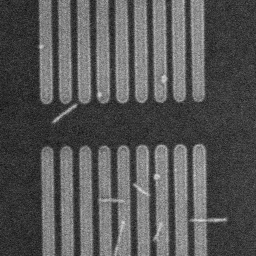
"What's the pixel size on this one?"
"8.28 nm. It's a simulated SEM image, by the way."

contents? groups of lines, slits or small figures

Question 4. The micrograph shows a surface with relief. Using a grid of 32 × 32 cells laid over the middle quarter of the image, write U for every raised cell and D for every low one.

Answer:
DDUUDDUUDDDUUDDDUUDDDUUDDUUDDDUU
DDUUDDUUDDDUUDDDUUDDDUUDDUUUDDUU
DDUUDDUUDDDUUDDDUUDDDUUDDUUUDDUU
DDUUDDUUUDDUUDDDUUDDDUUDDUUUDDUU
DDUUDDUUUDDUUDDDUUDDDUUDDUUUDDUU
DDUUDDDUUDDUUDDDUUDDDUUDDUUUDDUU
DDUUDDDUUDDUUDDDUUDDDUUDDUUUDDUU
DDUUDDDUUDDUUDDDUUDDDUUDDUUUDDUU
DDUUDDUUUDDUUUDDUUDDUUUDDUUUDDUU
DUUUUUUUUUUUUUUUUUUUUUUUUUUUUUUU
UUUUUUUUUUUUUUUUUUUUUUUUUUUUUUUU
UUUUUUUUUUUUUUUUUUUUUUUUUUUUUUUU
UUUUUUUUUUUUUUUUUUUUUUUUUUUUUUUU
UUUUUUUUUUUUUUUUUUUUUUUUUUUUUUUU
UUUUUUUUUUUUUUUUUUUUUUUUUUUUUUUU
UUUUUUUUUUUUUUUUUUUUUUUUUUUUUUUU
UUUUUUUUUUUUUUUUUUUUUUUUUUUUUUUU
UUUUUUUUUUUUUUUUUUUUUUUUUUUUUUUU
UUUUUUUUUUUUUUUUUUUUUUUUUUUUUUUU
UUUUUUUUUUUUUUUUUUUUUUUUUUUUUUUU
UUUUUUUUUUUUUUUUUUUUUUUUDUUUUUUU
DDUUDDUUUDDUUUDDUUDDDUUDDDUUDDUU
DDUUDDDUUDDUUUDDUUDDDUUDDDUUDDUU
DDUUDDDUUDDUUUDDUUDDDUUDDDUUDDUU
DDUUDDDUUDDUUUDDUUDDDUUDDDUUDDUU
DDUUDDDUUDDUUUDDUUDDDUUDDDUUDDUU
DDUUDDDUUDDUUUDDUUDDDUUDDDUUDDUU
DDUUDDDUUDDUUUDDUUDDDUUDDDUUDDUU
DDUUDDDUUDDUUUDDUUDDDUUUDDUUDDUU
DDUUDDDUUDDUUUDDUUDDDUUDDDUUDDUU
DDUUDDDUUDDUUUDDUUDDDUUDDDUUDDUU
DDUUDDDUUDDUUUDDUUUDDUUDDDUUDDUU